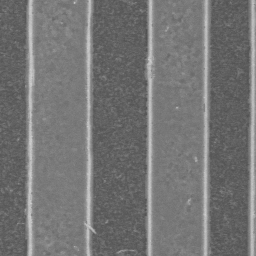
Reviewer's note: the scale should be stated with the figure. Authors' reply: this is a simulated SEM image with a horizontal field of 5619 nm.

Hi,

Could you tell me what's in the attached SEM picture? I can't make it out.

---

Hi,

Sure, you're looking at one or a few lines or trenches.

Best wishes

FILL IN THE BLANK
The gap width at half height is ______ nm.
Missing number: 1150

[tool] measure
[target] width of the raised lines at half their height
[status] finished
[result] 1250 nm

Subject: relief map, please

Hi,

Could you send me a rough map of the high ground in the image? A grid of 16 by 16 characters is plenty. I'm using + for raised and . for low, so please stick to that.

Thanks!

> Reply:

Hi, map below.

..++++...++++...
..++++...++++...
..++++...++++...
..+++....++++...
..++++...++++...
..++++...++++...
..++++...++++...
..++++...++++...
..++++...++++...
..++++...++++...
..++++...++++...
..++++...++++...
..++++...++++...
..++++...++++...
..++++...++++...
..++++...++++...